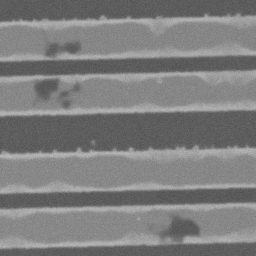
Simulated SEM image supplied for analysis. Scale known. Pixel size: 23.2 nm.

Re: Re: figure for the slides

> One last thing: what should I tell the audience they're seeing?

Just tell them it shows lines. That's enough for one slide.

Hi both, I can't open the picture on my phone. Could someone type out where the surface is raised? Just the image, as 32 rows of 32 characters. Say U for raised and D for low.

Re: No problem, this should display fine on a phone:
DDDDDDDDDDDDDDDDDDDDDDDDDDDDDDDD
DDDDDDDDDDDDDDDDDDDDDDDDDDDDDDDD
DDDDDDDDDDDDDDDUUDDDDDUUUUUUUUUU
UUUUUUUUUUUUUUUUUUUUUUUUUUUUUUUU
UUUUUUUUUUUUUUUUUUUUUUUUUUUUUUUU
UUUUUUUUUUUUUUUUUUUUUUUUUUUUUUUU
UUUUUUUUUUUUUUUUUUUUUUUUUUUUDUUU
DDDDDDDDDDDDDDDDDDDDDDDDDDDDDDDD
DDDDDDDDDDDDDDDDDDDDDDDDDDDDDDDD
DDDDDDDDDDDUUUDDDUUUUUUUUUUUUUUU
UUUUUUUUUUUUUUUUUUUUUUUUUUUUUUUU
UUUUUUUUUUUUUUUUUUUUUUUUUUUUUUUU
UUUUUUUUUUUUUUUUUUUUUUUUUUUUUUUU
UUUUUUUUUUUUUUUUUUUUUUUUUUUUUDDD
DDDDDDDDDDDDDDDDDDDDDDDDDDDDDDDD
DDDDDDDDDDDDDDDDDDDDDDDDDDDDDDDD
DDDDDDDDDDDDDDDDDDDDDDDDDDDDDDDD
DDDDDDDDDDDDDDDDDDDDDDDDDDDDDDDD
DDDDDDDDDDDDDDDDDDDDDDDDDDDDDDDD
UDDUUUUUUUUUUUUUUUUUUUUUUUUUUUUU
UUUUUUUUUUUUUUUUUUUUUUUUUUUUUUUU
UUUUUUUUUUUUUUUUUUUUUUUUUUUUUUUU
UUUUUUUUUUUUUUUUUUUUUUUUUUUUUUUU
UUUUUUUUUUUUUUUUUDDDDDDDDDDDDDDD
DDDDDDDDDDDDDDDDDDDDDDDDDDDDDDDD
DDDDDDDDDDDDDDDDDDDDDDDDDDDDDDDD
UDUUUUUUUUUUUUUUUUUUUUUUUUUUUUUU
UUUUUUUUUUUUUUUUUUUUUUUUUUUUUUUU
UUUUUUUUUUUUUUUUUUUUUUUUUUUUUUUU
UUUUUUUUUUUUUUUUUUUUUUUUUUUUUUUU
UUUUUUUUUUUUDDDDDDDDDDDDDDDDDDDD
DDDDDDDDDDDDDDDDDDDDDDDDDDDDDDDD